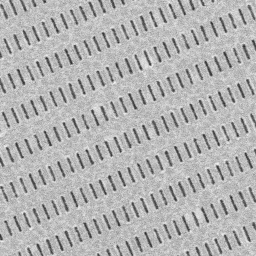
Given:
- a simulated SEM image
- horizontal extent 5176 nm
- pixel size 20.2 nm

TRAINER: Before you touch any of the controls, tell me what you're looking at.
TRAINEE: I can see a regular array of holes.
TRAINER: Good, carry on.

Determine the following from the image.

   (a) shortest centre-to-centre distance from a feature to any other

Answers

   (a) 0.206 microns